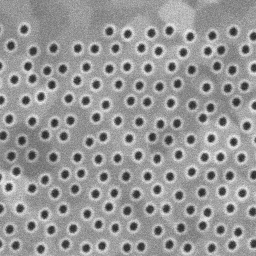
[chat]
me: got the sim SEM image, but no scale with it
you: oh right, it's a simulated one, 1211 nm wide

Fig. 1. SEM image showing a regular array of holes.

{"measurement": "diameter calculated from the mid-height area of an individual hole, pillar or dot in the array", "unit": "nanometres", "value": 47.7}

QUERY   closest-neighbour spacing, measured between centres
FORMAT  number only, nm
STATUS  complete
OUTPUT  82